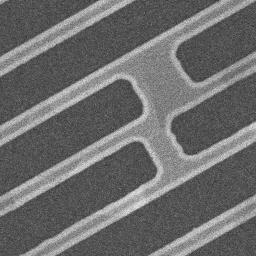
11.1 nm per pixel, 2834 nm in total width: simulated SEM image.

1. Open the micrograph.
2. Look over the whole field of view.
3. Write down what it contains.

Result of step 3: one or a few lines or trenches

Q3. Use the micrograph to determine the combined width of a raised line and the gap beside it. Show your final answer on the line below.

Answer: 683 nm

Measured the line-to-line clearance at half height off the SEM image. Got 540 nm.